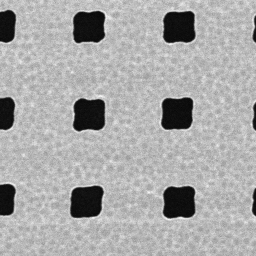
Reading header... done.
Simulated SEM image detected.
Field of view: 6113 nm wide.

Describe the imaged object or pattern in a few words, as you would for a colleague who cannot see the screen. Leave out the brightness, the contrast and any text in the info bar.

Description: holes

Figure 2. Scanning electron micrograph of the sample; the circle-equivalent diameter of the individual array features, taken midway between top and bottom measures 0.833 microns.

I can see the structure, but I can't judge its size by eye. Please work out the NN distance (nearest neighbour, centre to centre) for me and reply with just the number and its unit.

2070 nanometres